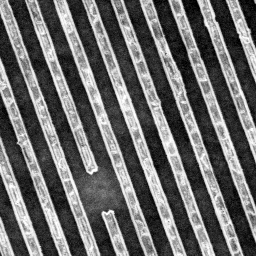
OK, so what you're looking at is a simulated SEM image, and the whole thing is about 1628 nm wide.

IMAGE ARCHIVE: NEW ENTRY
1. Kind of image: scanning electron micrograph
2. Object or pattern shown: parallel lines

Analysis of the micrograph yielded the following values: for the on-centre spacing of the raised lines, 172 nanometres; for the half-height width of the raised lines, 65.1 nm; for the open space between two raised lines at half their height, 16.7 px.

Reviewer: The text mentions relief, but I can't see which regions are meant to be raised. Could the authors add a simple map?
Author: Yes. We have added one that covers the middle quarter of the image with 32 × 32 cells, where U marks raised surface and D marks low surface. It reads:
DDDUUUDDDDDUUDDDDDUUUDDDDUUUDDDD
DDDDUUUDDDDUUUDDDDUUUDDDDDUUDDDD
DDDDUUUDDDDUUUDDDDDUUDDDDDUUUDDD
DDDDDUUDDDDDUUDDDDDUUUDDDDUUUDDD
DDDDDUUUDDDDUUUDDDDUUUDDDDDUUUDD
UDDDDUUUDDDDUUUDDDDDUUDDDDDUUUDD
UDDDDDUUDDDDDUUDDDDDUUUDDDDUUUDD
UDDDDDUUUDDDDUUUDDDDUUUDDDDDUUDD
UUDDDDUUUDDDDDUUDDDDDUUDDDDDUUDD
UUDDDDDUUDDDDDUUUDDDDUUUDDDDUUUD
UUUDDDDUUUDDDDUUUDDDDUUUDDDDDUUD
UUUDDDDUUUDDDDDUUDDDDDUUDDDDDUUU
DUUDDDDDUUDDDDDUUUDDDDUUUDDDDUUU
DUUUDDDDUUUDDDDUUUDDDDDUUDDDDDUU
DUUUDDDDDUUDDDDDUUDDDDDUUUDDDDUU
DDUUDDDDDUUDDDDDUUUDDDDUUUDDDDUU
DDUUUDDDDUUUDDDDUUUDDDDDUUDDDDDU
DDUUUDDDDDUUDDDDDUUDDDDDUUUDDDDU
DDDUUDDDDDUUUDDDDUUUDDDDUUUDDDDD
DDDUUUDDDDUUUDDDDUUUDDDDDUUDDDDD
DDDDUUDDDDDUUDDDDDUUUDDDDUUUDDDD
DDDDUUUDDDDUUUDDDDUUUDDDDUUUDDDD
DDDDUUUDDDDUUUDDDDDUUDDDDDUUDDDD
DDDDDUUDDDDDUUDDDDDUUUDDDDUUUDDD
UDDDDUUUDDDDUUUDDDDUUUDDDDUUUDDD
UDDDDUUUDDDDUUUDDDDDUUDDDDDUUDDD
UDDDDDUUDDDDDUUUDDDDUUDDDDDUUUDD
UUDDDDDDDDDDDUUUDDDDDUUDDDDDUUDD
UUDDDDDDDDDDDDUUDDDDDUUDDDDDUUUD
UUDDDDDDDDDDDDUUUDDDDUUUDDDDUUUD
UUDDDDDDDDDDDDDUUDDDDUUUDDDDDUUD
UUUDDDDDDDDDDDDUUDDDDDUUDDDDDUUU